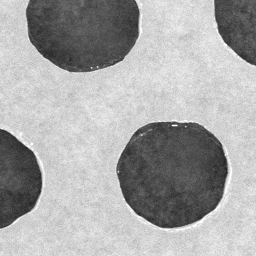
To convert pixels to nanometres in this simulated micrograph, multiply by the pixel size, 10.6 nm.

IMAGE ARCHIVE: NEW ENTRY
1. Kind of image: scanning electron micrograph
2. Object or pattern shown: holes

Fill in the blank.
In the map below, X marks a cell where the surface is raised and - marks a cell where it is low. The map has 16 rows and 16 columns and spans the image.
XX-------XXXX---
XX-------XXXXX--
XX-------XXXXX--
XXX-----XXXXXXX-
XXXXXXXXXXXXXXXX
XXXXXXXXXXXXXXXX
XXXXXXXXXXXXXXXX
XXXXXXXXXXXXXXXX
-XXXXXXX-----XXX
--XXXXXX------XX
---XXXX-------XX
---XXXX-------XX
--XXXXXX------XX
-XXXXXXXX----XXX
XXXXXXXXXXXXXXXX
XXXXXXXXXXXXXXXX